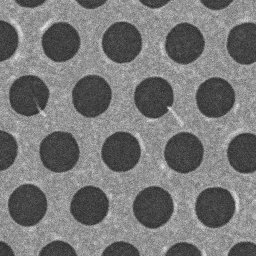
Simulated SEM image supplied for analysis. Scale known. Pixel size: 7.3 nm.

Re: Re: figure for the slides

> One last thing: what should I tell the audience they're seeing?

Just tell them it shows a regular array of holes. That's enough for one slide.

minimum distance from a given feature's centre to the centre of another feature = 450 nanometres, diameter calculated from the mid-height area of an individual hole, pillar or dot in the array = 302 nm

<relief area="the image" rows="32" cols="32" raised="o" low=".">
oo...ooooo...ooooo...oooo....ooo
oooooooooooooooooooooooooooooooo
oooooooooooooooooooooooooooooooo
..oooo...oooo....ooooo...oooo...
..ooo.....ooo.....ooo....ooo....
..ooo.....ooo.....ooo.....oo....
..ooo.....ooo.....ooo....oooo...
.ooooo...ooooo...oooo...ooooo...
oooooooooooooooooooooooooooooooo
ooo..oooooo.oooooooooooooooooooo
o.....ooo.....ooo....oooo....ooo
o.....ooo.....ooo.....ooo....ooo
o.....ooo.....ooo.....oo.....ooo
oo....ooo.....ooo....oooo....ooo
ooo.oooooo..oooooo..oooooo..oooo
oooooooooooooooooooooooooooooooo
.oooooo.oooooo..oooooooooooooooo
..ooo.....ooo....oooo....oooo...
..ooo.....ooo.....ooo....ooo....
..ooo.....ooo.....ooo....ooo....
..ooo.....ooo....oooo....oooo...
ooooooo.oooooo..oooooo..oooooo..
oooooooooooooooooooooooooooooooo
oo...ooooo..oooooo..oooooo..oooo
o.....ooo....oooo....oooo....ooo
o.....ooo.....ooo.....oo.....ooo
o.....ooo.....ooo.....oo.....ooo
oo...ooooo...oooo....oooo....ooo
oooooooooooooooooo..oooooo.ooooo
oooooooooooooooooooooooooooooooo
.ooooo...ooooo..oooooo..ooooo...
..ooo.....ooo....oooo....oooo...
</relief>